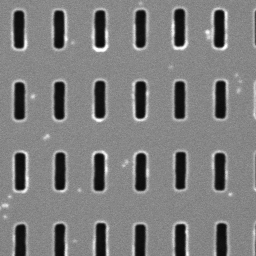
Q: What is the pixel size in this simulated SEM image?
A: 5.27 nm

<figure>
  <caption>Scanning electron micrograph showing a regular array of holes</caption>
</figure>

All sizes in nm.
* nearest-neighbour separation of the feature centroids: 209